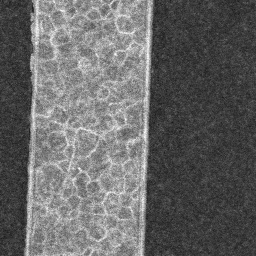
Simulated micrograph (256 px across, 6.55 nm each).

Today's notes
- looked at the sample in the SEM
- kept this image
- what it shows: one or a few lines or trenches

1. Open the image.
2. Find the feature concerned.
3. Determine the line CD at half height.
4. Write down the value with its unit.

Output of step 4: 738 nanometers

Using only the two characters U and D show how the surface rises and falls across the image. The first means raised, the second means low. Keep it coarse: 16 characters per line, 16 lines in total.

DDUUUUUUUDDDDDDD
DDUUUUUUUDDDDDDD
DDUUUUUUUDDDDDDD
DDUUUUUUUDDDDDDD
DDUUUUUUUDDDDDDD
DDUUUUUUUDDDDDDD
DDUUUUUUUDDDDDDD
DDUUUUUUUDDDDDDD
DDUUUUUUUDDDDDDD
DDUUUUUUUDDDDDDD
DDUUUUUUUDDDDDDD
DDUUUUUUUDDDDDDD
DDUUUUUUUDDDDDDD
DDUUUUUUUDDDDDDD
DDUUUUUUUDDDDDDD
DDUUUUUUUDDDDDDD